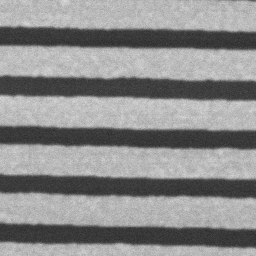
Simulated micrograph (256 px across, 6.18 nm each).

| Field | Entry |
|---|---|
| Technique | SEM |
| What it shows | lines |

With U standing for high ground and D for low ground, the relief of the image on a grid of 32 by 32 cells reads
UUUUUUUUUUUUUUUUUUUUUUUUUUUUUUUU
UUUUUUUUUUUUUUUUUUUUUUUUUUUUUUUU
UUUUUUUUUUUUUUUUUUUUUUUUUUUUUUUU
DDDDDDDDDUUUUUUUUUUUUUUUUUUUUUUU
DDDDDDDDDDDDDDDDDDDDDDDDDDDDDDDD
DDDDDDDDDDDDDDDDDDDDDDDDDDDDDDDD
UUUUUUUUUUUUUUUUUUUUUUUUUUUUUUUU
UUUUUUUUUUUUUUUUUUUUUUUUUUUUUUUU
UUUUUUUUUUUUUUUUUUUUUUUUUUUUUUUU
DDDDUUUUUUUUUUUUUUUUUUUUUUUUUUUU
DDDDDDDDDDDDDDDDDDDDDDDDDDDDDDDD
DDDDDDDDDDDDDDDDDDDDDDDDDDDDDDDD
UUUUUUUUUUUUUUUUUUUUUUUUDDDDDDDD
UUUUUUUUUUUUUUUUUUUUUUUUUUUUUUUU
UUUUUUUUUUUUUUUUUUUUUUUUUUUUUUUU
UUUUUUUUUUUUUUUUUUUUUUUUUUUUUUUU
DDDDDDDDDDDDDDDDDDDDDDDDDDDDDDDD
DDDDDDDDDDDDDDDDDDDDDDDDDDDDDDDD
UUUUUUUUUUUUUUUUUDDDDDDDDDDDDDDD
UUUUUUUUUUUUUUUUUUUUUUUUUUUUUUUU
UUUUUUUUUUUUUUUUUUUUUUUUUUUUUUUU
UUUUUUUUUUUUUUUUUUUUUUUUUUUUUUUU
DDDDDDDDDDDDDDDDDDDDDDDDDDDDDDDD
DDDDDDDDDDDDDDDDDDDDDDDDDDDDDDDD
UUUUUUUUDDDDDDDDDDDDDDDDDDDDDDDD
UUUUUUUUUUUUUUUUUUUUUUUUUUUUUUUU
UUUUUUUUUUUUUUUUUUUUUUUUUUUUUUUU
UUUUUUUUUUUUUUUUUUUUUUUUUUUUUUUU
DDDDDDDDDDDDDDDDDDDDDDDDDDDDUUUU
DDDDDDDDDDDDDDDDDDDDDDDDDDDDDDDD
UUDDDDDDDDDDDDDDDDDDDDDDDDDDDDDD
UUUUUUUUUUUUUUUUUUUUUUUUUUUUUUUU